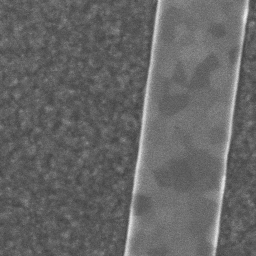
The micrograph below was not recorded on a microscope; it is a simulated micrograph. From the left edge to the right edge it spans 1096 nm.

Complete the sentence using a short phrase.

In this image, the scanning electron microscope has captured one or a few lines or trenches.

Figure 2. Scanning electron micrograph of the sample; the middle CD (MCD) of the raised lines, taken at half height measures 380 nm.